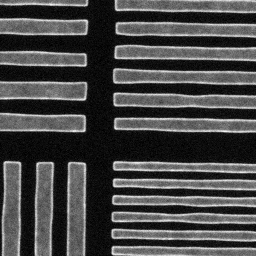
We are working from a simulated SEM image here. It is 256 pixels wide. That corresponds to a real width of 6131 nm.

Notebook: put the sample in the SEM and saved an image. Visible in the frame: groups of lines, slits or small figures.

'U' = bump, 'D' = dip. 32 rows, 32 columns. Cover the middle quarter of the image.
DDDDDDDDDDDDDDDDDDDDDDDDDDDDDDDD
DDDDDDDDDDDDDUUUUUDDDDDDDDDDDDDD
DDDDDDDDDDDDUUUUUUUUUUUUUUUUUUUU
DDDDDDDDDDDDUUUUUUUUUUUUUUUUUUUU
DDDDDDDDDDDDDUUUUUUUUUUUUUUUUUUU
UUUUUUDDDDDDDDDDDDDDDDDDDDDDDDDD
UUUUUUDDDDDDDDDDDDDDDDDDDDDDDDDD
UUUUUDDDDDDDDUUUDDDDDDDDDDDDDDDD
UUUUUDDDDDDDUUUUUUUUUUUUUUUUUUUU
DDDDDDDDDDDDUUUUUUUUUUUUUUUUUUUU
DDDDDDDDDDDDDDDDDDDUUUUUUUUUUUUU
DDDDDDDDDDDDDDDDDDDDDDDDDDDDDDDD
DDDDDDDDDDDDDDDDDDDDDDDDDDDDDDDD
UUUUUDDDDDDDDDDDDDDDDDDDDDDDDDDD
UUUUUDDDDDDDDUUUUUUUUUUUUUUUUUUU
UUUUUDDDDDDDDUUUUUUUUUUUUUUUUUUU
UUUUUDDDDDDDDDDDDDDDDDDDDUUUUUUU
DDDDDDDDDDDDDDDDDDDDDDDDDDDDDDDD
DDDDDDDDDDDDDDDDDDDDDDDDDDDDDDDD
DDDDDDDDDDDDDDDDDDDDDDDDDDDDDDDD
DDDDDDDDDDDDDDDDDDDDDDDDDDDDDDDD
DDDDDDDDDDDDDDDDDDDDDDDDDDDDDDDD
DDDDDDDDDDDDDDDDDDDDDDDDDDDDDDDD
DDDDDDDDDDDDDDDDDDDDDDDDDDDDDDDD
DDDDDDDDDDDDDUDDDDDDDDDDDDDDDDDD
DUUUUDDDDDDDUUUUUUUUUUUUUUUUUUUU
DUUUUDDDDDDDDDDDDDDUUUUUUUUUUUUU
DUUUUDDDDDDDDDDDDDDDDDDDDDDDDDDD
DUUUUDDDDDDDDDDDDDDDDDDDDDDDDDDD
DUUUUDDDDDDDUUUUUUUUUUUUUUUUUUUU
DUUUUDDDDDDDDUUUUUUUUUUUUUUUUUUU
DUUUUDDDDDDDDDDDDDDDDDDDDDDDDDDD